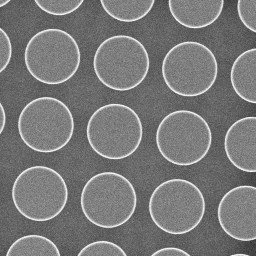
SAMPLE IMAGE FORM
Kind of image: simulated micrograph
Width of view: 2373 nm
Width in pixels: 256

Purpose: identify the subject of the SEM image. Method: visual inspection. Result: an array of small figures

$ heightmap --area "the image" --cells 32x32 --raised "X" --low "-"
X----XXXXX---XXXXXX--XXXXXXX--XX
------XXX----XXXXXX--XXXXXXX--XX
---------------XX-----XXXXX---XX
-------------------------------X
X---XXXXX------X----------------
X---XXXXXX---XXXXX-----XX-------
X--XXXXXXX--XXXXXX---XXXXX-----X
X--XXXXXXX--XXXXXXX-XXXXXXX---XX
X--XXXXXXX--XXXXXXX-XXXXXXX--XXX
----XXXXX---XXXXXX--XXXXXXX--XXX
-------------XXXX----XXXXXX--XXX
----------------------XXX-----XX
----XXX------------------------X
---XXXXX-----XXX----------------
X--XXXXXX--XXXXXX----XXXX-------
X-XXXXXXX--XXXXXXX--XXXXXX---XXX
--XXXXXXX--XXXXXXX--XXXXXX--XXXX
---XXXXXX--XXXXXXX--XXXXXX--XXXX
----XXXX----XXXXX---XXXXXX--XXXX
-------------XXX----XXXXXX--XXXX
----------------------XX-----XXX
---XXXX-------------------------
--XXXXXX---XXXXX-----XX---------
--XXXXXX---XXXXXX---XXXXX-----XX
--XXXXXX--XXXXXXX--XXXXXX---XXXX
--XXXXXX--XXXXXXX--XXXXXXX-XXXXX
---XXXX---XXXXXXX--XXXXXX--XXXXX
----XX-----XXXXX---XXXXXX--XXXXX
--------------------XXXX----XXXX
---XX------------------------XXX
--XXXXX----XXX------------------
-XXXXXX---XXXXX-----XXX---------